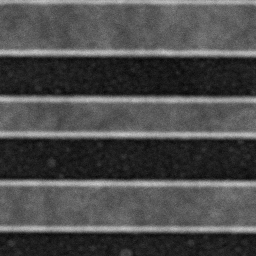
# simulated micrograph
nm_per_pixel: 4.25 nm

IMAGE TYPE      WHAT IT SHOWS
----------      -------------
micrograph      one or a few lines or trenches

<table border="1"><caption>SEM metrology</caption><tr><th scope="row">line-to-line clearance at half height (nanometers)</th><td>205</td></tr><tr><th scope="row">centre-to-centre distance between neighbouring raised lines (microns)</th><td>0.381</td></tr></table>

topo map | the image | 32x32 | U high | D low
UUUUUUUUUUUUUUUUUUUUUUUUUUUUUUUU
UUUUUUUUUUUUUUUUUUUUUUUUUUUUUUUU
UUUUUUUUUUUUUUUUUUUUUUUUUUUUUUUU
UUUUUUUUUUUUUUUUUUUUUUUUUUUUUUUU
UUUUUUUUUUUUUUUUUUUUUUUUUUUUUUUU
UUUUUUUUUUUUUUUUUUUUUUUUUUUUUUUU
UUUUDDDDDDUDDDDDDDDDDUUUUUUUUUUU
DDDDDDDDDDDDDDDDDDDDDDDDDDDDDDDD
DDDDDDDDDDDDDDDDDDDDDDDDDDDDDDDD
DDDDDDDDDDDDDDDDDDDDDDDDDDDDDDDD
DDDDDDDDDDDDDDDDDDDDDDDDDDDDDDDD
DDDDDDDDDDDDDDDDDDDDDDDDDDDDDDDD
DDDDDDDDDDDDDDDDDDDDDDDDDDDDDDDD
UUUUUUUUUUUUUUUUUUUUUUUUUUUUUUUU
UUUUUUUUUUUUUUUUUUUUUUUUUUUUUUUU
UUUUUUUUUUUUUUUUUUUUUUUUUUUUUUUU
UUUUUUUUUUUUUUUUUUUUUUUUUUUUUUUU
DDDDDDDDDDDDDDDDDDDDDDDDDDDDDDDD
DDDDDDDDDDDDDDDDDDDDDDDDDDDDDDDD
DDDDDDDDDDDDDDDDDDDDDDDDDDDDDDDD
DDDDDDDDDDDDDDDDDDDDDDDDDDDDDDDD
DDDDDDDDDDDDDDDDDDDDDDDDDDDDDDDD
DDDDDDDDDDDDDDDDDDDDDDDDDDDDDDDD
UUUUUUUUUUUUUUUUUUUUUUUUUUUUUUUU
UUUUUUUUUUUUUUUUUUUUUUUUUUUUUUUU
UUUUUUUUUUUUUUUUUUUUUUUUUUUUUUUU
UUUUUUUUUUUUUUUUUUUUUUUUUUUUUUUU
UUUUUUUUUUUUUUUUUUUUUUUUUUUUUUUU
UUUUUUUUUUUUUUUUUUUUUUUUUUUUUUUU
DDDDDDDDDDDDDDDDDDDDDDDDDDDDDDDD
DDDDDDDDDDDDDDDDDDDDDDDDDDDDDDDD
DDDDDDDDDDDDDDDDDDDDDDDDDDDDDDDD